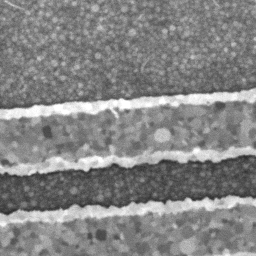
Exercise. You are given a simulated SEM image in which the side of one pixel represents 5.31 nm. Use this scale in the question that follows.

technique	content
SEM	one or a few lines or trenches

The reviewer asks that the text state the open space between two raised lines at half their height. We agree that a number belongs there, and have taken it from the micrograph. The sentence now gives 49.4 px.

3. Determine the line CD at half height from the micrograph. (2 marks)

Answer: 301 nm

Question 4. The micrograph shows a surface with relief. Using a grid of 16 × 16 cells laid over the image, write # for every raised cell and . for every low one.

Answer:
................
................
................
................
................
................
.......#.#######
################
################
################
##..............
................
................
..#.############
################
################